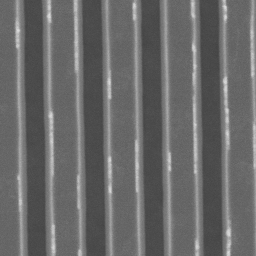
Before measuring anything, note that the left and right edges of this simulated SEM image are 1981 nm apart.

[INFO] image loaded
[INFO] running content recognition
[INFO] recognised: parallel lines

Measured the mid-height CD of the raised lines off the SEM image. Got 257 nm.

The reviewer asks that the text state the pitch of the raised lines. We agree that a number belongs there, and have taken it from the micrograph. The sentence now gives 454 nanometers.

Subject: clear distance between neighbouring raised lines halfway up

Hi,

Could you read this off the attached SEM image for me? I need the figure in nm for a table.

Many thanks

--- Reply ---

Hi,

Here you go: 196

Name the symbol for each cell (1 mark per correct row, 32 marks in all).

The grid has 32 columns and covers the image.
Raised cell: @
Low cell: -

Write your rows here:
@@----@@@@---@@@@---@@@@----@@@@
@@@---@@@@---@@@@---@@@@@---@@@@
@@@---@@@@---@@@@---@@@@@---@@@@
@@@---@@@@---@@@@---@@@@@---@@@@
@@@---@@@@---@@@@----@@@@---@@@@
@@@---@@@@---@@@@----@@@@---@@@@
@@@---@@@@---@@@@----@@@@---@@@@
@@@---@@@@---@@@@----@@@@---@@@@
@@@---@@@@---@@@@----@@@@---@@@@
@@@---@@@@---@@@@----@@@@---@@@@
@@@---@@@@---@@@@----@@@@---@@@@
@@@---@@@@---@@@@----@@@@---@@@@
@@@---@@@@---@@@@----@@@@---@@@@
@@@---@@@@---@@@@----@@@@---@@@@
@@@---@@@@---@@@@----@@@@---@@@@
@@@---@@@@---@@@@----@@@@---@@@@
@@@---@@@@---@@@@----@@@@---@@@@
@@@---@@@@---@@@@----@@@@---@@@@
@@@---@@@@---@@@@----@@@@---@@@@
@@@---@@@@---@@@@----@@@@---@@@@
@@@---@@@@---@@@@----@@@@---@@@@
@@@---@@@@---@@@@----@@@@---@@@@
@@@---@@@@---@@@@----@@@@---@@@@
@@@---@@@@----@@@@---@@@@---@@@@
@@@---@@@@----@@@@---@@@@---@@@@
@@@---@@@@----@@@@---@@@@---@@@@
@@@---@@@@----@@@@---@@@@---@@@@
@@@---@@@@----@@@@---@@@@---@@@@
@@@---@@@@----@@@@---@@@@---@@@@
@@@---@@@@----@@@@---@@@@---@@@@
@@@---@@@@----@@@@---@@@@---@@@@
@@@---@@@@----@@@@---@@@@---@@@@